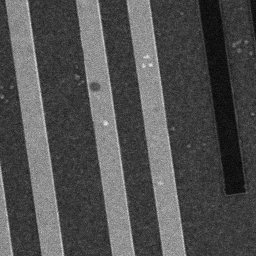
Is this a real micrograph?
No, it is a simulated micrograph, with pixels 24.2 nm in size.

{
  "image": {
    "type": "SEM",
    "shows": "parallel lines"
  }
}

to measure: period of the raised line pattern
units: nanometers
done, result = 1510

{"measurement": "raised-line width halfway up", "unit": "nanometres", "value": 513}